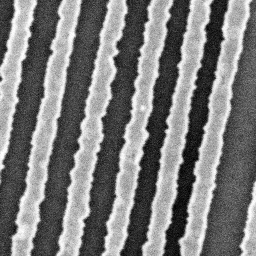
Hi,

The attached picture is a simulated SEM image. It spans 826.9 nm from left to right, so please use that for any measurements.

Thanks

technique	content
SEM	lines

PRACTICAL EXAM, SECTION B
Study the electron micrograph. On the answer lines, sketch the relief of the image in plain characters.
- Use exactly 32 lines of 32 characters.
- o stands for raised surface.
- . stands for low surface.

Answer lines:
..ooo...oo....oo...oo...oo...oo.
..oo...ooo...ooo...oo...oo..ooo.
..oo...ooo...ooo...oo...oo..ooo.
..oo...oo....oo...ooo..ooo..ooo.
.ooo...oo....oo...ooo..ooo..oo..
.oo....oo....o....oo...ooo..oo..
.oo....oo...ooo...oo...oo...oo..
.oo...ooo...oo...ooo...oo..ooo..
ooo...oo....oo...ooo..ooo..ooo..
ooo...oo....oo...ooo..oo...oo...
oo....oo...ooo...oo...oo...oo...
oo....oo...ooo...oo...oo..ooo...
oo...ooo...ooo...oo...oo..ooo...
oo...ooo...oo....oo..ooo..ooo...
oo...oo....oo....oo..ooo..oo....
o....oo...ooo...oo...oo...oo....
o...ooo...ooo...oo...oo...oo....
o...ooo...ooo...oo...oo..ooo....
o...oo....oo...ooo..ooo..ooo....
o...oo...ooo...ooo..ooo..oo.....
....oo...ooo...oo...ooo..oo.....
....oo...ooo...oo...oo..ooo.....
...ooo...oo....oo...oo..ooo.....
...oo....oo....oo...oo..ooo.....
...oo....oo....oo..ooo..oo......
...oo...ooo...ooo..ooo..oo.....o
..ooo...ooo...oo...oo...oo.....o
..ooo...oo....oo...oo...oo.....o
..ooo...oo...ooo...oo..ooo.....o
..oo....oo...ooo...oo..oo......o
..oo...ooo...oo...ooo..oo.....oo
..oo...ooo...oo...oo...oo.....oo